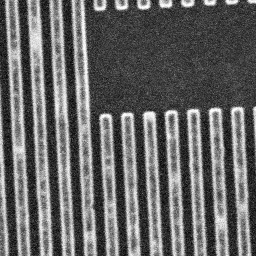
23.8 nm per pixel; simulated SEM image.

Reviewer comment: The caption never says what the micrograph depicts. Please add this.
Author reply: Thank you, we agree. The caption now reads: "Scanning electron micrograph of parallel lines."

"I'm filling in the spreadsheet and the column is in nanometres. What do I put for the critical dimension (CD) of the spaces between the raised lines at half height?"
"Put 286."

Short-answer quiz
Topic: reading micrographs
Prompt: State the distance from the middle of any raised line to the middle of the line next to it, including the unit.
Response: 524 nm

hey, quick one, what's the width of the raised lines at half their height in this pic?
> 10.1 px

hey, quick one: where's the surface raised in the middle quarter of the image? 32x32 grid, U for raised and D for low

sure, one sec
DDDUUDDDDDDDDDDDDDDDDDDDDDDDDDDD
DDDUUDDDDDDDDDDDDDDDDDDDDDDDDDDD
DDDUUUDDDDDDDDDDDDDDDDDDDDDDDDDD
DDDUUUDDDDDDDDDDDDDDDDDDDDDDDDDD
DDDUUUDDDDDDDDDDDDDDDDDDDDDDDDDD
DDDUUUDDDDDDDDDDDDDDDDDDDDDDDDDD
DDDUUUDDDDDDDDDDDDDDDDDDDDDDDDDD
DDDUUUDDDDDDDDDDDDDDDDDDDDDDDDDD
DDDDUUDDDDDDDDDDDDDDDDDDDDDDDDDD
DDDDUUDDDDDDDDDDDDDDDDDDDDDDDDDD
DDDDUUDDDDDDDDDDDDDDDDDDDDDDDDDD
DDDDUUDDDDDDDDDDDDDDDDDDDDDDDDDD
UDDDUUDDDDDDDDDDDDDDDUDDDDUUDDDU
UDDDUUDDDUUUDDDUUDDDUUDDDDUUDDDU
UDDDUUDDDUUUDDDUUDDDUUDDDDUUDDDU
UDDDUUDDDUUUDDDUUDDDUUDDDDUUDDDU
UDDDUUDDDUUUDDDUUDDDUUUDDDUUDDDU
UDDDUUDDDUUUDDDUUDDDDUUDDDUUDDDD
UDDDUUDDDDUUDDDUUDDDDUUDDDUUDDDD
UDDDUUDDDDUUDDDUUDDDDUUDDDUUDDDD
UDDDUUDDDDUUDDDUUDDDDUUDDDUUDDDD
UDDDUUDDDDUUDDDUUUDDDUUDDDUUUDDD
UDDDUUUDDDUUDDDUUUDDDUUDDDUUUDDD
UDDDUUUDDDUUDDDUUDDDDUUDDDUUDDDD
UDDDUUUDDDUUDDDUUUDDDUUDDDUUDDDD
UDDDUUUDDDUUDDDUUUDDDUUDDDUUUDDD
UDDDUUUDDDUUDDDUUUDDDUUDDDUUUDDD
UDDDUUUDDDUUDDDDUUDDDUUDDDDUUDDD
UDDDDUUDDDUUDDDDUUDDDUUDDDDUUDDD
UDDDDUUDDDUUDDDDUUDDDUUDDDDUUDDD
UDDDDUUDDDUUDDDDUUDDDUUDDDDUUDDD
UDDDDUUDDDUUUDDDUUDDDUUDDDDUUDDD